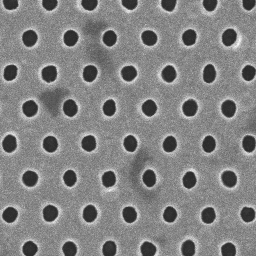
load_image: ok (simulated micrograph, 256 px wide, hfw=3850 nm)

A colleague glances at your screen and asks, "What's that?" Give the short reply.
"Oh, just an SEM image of a regular array of holes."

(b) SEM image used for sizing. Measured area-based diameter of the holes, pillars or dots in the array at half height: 15.9 px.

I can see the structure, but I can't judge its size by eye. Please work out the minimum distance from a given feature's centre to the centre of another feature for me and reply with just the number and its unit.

0.59 microns